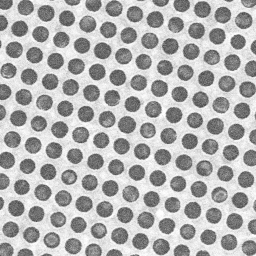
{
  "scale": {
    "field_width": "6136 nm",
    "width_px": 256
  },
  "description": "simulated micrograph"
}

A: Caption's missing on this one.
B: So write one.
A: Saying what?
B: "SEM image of a regular array of holes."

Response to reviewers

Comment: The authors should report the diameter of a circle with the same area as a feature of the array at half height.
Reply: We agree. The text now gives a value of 414 nm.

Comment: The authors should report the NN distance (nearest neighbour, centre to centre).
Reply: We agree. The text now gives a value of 509 nm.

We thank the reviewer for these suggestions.